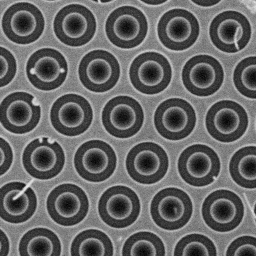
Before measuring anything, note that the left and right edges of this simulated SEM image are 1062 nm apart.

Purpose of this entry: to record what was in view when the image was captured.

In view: an array of small figures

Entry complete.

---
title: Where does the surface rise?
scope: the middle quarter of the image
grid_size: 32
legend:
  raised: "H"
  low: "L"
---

LHHHLLHHHHHLLLHHLLLHHHHHLLLHHHLL
LHHLLLHHHHHHLLHHLLLHHHHHHLLHHHLL
LHHLLLHHHHHHLLHHLLLHHHHHHLLHHLLL
LHHHLLHHHHHLLLHHLLLHHHHHHLLHHLLL
HHHHLLLHHHLLLHHHHLLHHHHHLLLHHHLL
HHHHHLLLLLLLLHHHHLLLLLLLLLHHHHLL
HHHHHHLLLLLHHHHHHHLLLLLLLHHHHHHL
HLLHHHHHHHHHHHHHHHHHLLLHHHHHHHHH
LLLLLHHHHHHHLLLLLHHHHHHHHHHLLHHH
LLLLLLHHHHHLLLLLLLLHHHHHHLLLLLLH
HHHHLLLHHHLLLHHHLLLHHHHLLLLLLLLL
HHHHHLLHHHLLHHHHHLLLHHHLLLHHHHLL
HHHHHLLHHLLLHHHHHHLLHHHLLHHHHHLL
HHHHHLLHHLLLHHHHHHLLHHLLLHHHHHHL
HHHHLLLHHHLLHHHHHHLLHHLLLHHHHHHL
LHHLLLHHHHLLLHHHHLLLHHHLLHHHHHLL
LLLLLLHHHHLLLLLLLLLHHHHLLLHHHLLL
LLLLLHHHHHHLLLLLLLHHHHHHLLLLLLLL
HHHHHHHHHHHHHLLLHHHHHHHHHLLLLLHH
HHHHHLLLLLHHHHHHHHHHLLHHHHHHHHHH
HHHHLLLLLLLLHHHHHLLLLLLLHHHHHHHL
HHHLLLHHHLLLLHHHLLLLLLLLLHHHHHLL
HHHLLHHHHHLLLHHHLLLHHHHLLLHHHLLL
HHLLLHHHHHHLLHHHLLHHHHHLLLHHHLLH
HHLLLHHHHHHLLHHLLLHHHHHHLLHHLLLH
HHHLLHHHHHHLLHHLLLHHHHHHLLHHLLLH
HHHLLLHHHHLLLHHHLLHHHHHLLLHHLLLH
HHHHLLLLLLLLHHHHLLLHHHLLLLHHHLLL
HHHHHLLLLLLHHHHHHLLLLLLLLHHHHLLL
HHHHHHHLLHHHHHHHHHLLLLLHHHHHHHLL
LLLLHHHHHHHHHLLHHHHHHHHHHHHHHHHH
LLLLLHHHHHHLLLLLLHHHHHHHLLLLLLHH